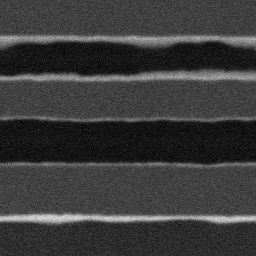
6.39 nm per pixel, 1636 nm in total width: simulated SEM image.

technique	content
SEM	lines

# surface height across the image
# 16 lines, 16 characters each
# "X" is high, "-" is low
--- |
XXXXXXXXXXXXXXXX
XXXXXXXXXXXXXXXX
---------------X
----------------
----------------
XXXXXXXXXXXXXXXX
XXXXXXXXXXXXXXXX
----XX--X---XX--
----------------
----------------
XXXXXXXXXXXXXXXX
XXXXXXXXXXXXXXXX
XXXXXXXXXXXXXXXX
XXXXXXXXXXXXXXXX
----------------
----------------